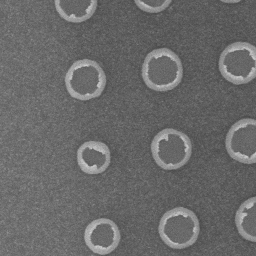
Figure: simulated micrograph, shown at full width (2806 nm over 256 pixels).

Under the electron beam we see raised bodies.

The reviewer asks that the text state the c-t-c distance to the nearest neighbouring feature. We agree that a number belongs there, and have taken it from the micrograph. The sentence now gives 849 nm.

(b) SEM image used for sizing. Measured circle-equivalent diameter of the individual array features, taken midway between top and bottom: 400 nm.